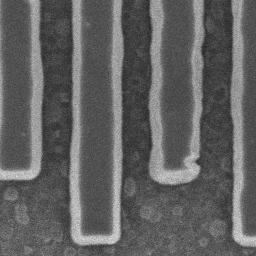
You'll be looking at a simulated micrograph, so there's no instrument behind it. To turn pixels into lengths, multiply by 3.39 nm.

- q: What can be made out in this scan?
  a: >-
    one or a few lines or trenches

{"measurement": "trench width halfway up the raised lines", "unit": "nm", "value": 136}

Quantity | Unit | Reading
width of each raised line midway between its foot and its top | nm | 139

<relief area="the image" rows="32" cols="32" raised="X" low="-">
XXXX------XXXXX-----XXXXX-----XX
XXXX------XXXXX-----XXXXX-----XX
XXXX------XXXXX-----XXXXX-----XX
XXXX------XXXXX-----XXXXX-----XX
XXXX------XXXXX-----XXXXX-----XX
XXXX------XXXXX----XXXXXX-----XX
XXXX------XXXXX----XXXXX------XX
XXXX------XXXXX----XXXXX------XX
XXXXX-----XXXXX-----XXXX------XX
XXXXX-----XXXXX-----XXXX------XX
XXXXX-----XXXXX-----XXXX------XX
XXXXX-----XXXXX----XXXXX------XX
XXXXX-----XXXXX----XXXXXX-----XX
XXXXX-----XXXXX----XXXXXX-----XX
XXXXX-----XXXXX----XXXXX------XX
XXXX------XXXXX-----XXXX------XX
XXXX------XXXXX-----XXXX------XX
XXXXX----XXXXXX-----XXXX------XX
XXXXX----XXXXXX-----XXXX------XX
XXXXX----XXXXXX-----XXXX------XX
XXXXX----XXXXXX-----XXXX------XX
XXXX-----XXXXXX-----XXXX------XX
---------XXXXXX---------------XX
---------XXXXXX---------------XX
---------XXXXXX---------------XX
---------XXXXXX---------------XX
---------XXXXXX---------------XX
----------XXXXX---------------XX
----------XXXXX---------------XX
----------XXXX----------------XX
--------------------------------
--------------------------------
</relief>